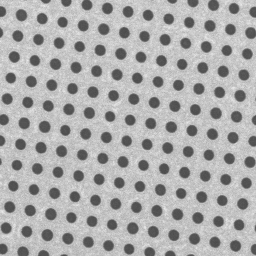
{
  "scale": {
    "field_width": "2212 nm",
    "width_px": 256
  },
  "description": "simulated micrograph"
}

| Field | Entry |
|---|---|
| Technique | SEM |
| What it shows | a regular array of holes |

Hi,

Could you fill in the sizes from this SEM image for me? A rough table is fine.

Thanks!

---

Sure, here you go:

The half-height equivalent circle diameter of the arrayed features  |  94 nanometres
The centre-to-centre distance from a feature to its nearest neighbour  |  179 nm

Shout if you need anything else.